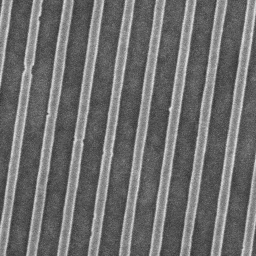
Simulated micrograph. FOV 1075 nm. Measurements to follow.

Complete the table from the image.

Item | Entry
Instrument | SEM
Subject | parallel lines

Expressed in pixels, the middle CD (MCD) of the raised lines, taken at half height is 8.79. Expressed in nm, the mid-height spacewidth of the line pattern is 90.5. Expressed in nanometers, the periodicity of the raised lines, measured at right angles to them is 128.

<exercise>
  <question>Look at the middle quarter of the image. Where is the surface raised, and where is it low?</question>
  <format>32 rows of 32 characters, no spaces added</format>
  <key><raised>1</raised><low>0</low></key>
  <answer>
00000110000001100000011000001110
00000110000001100000011000001100
00000110000001100000111000001100
00000110000001100000110000001100
00000110000001100000110000001100
00000110000011000000110000011100
00000110000011000000110000011100
00001100000011000000110000011100
00001100000011000000110000011000
00001100000011000001110000011000
00001100000011000001100000011000
00001100000111000001100000111000
00001100000110000001100000111000
00001100000110000001100000111000
00011000000110000001100000111000
00011000000110000001100000110000
00011000000110000011100000110000
00011000000110000011000000110000
00011000001110000011000000110000
00111000001100000011000000110000
00111000001100000011000000110000
00110000001100000011000001100000
00110000001100000011000001100000
00110000001100000111000001100000
00110000001100000110000001100000
00110000011100000110000001100000
00110000011000000110000011100000
01110000011000000110000011100000
01100000011000000110000011000000
01100000011000000110000011000000
01100000011000001100000011000000
01100000111000001100000011000001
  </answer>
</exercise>